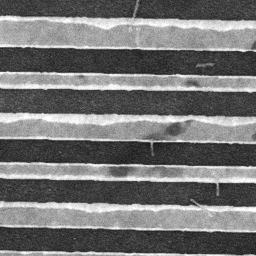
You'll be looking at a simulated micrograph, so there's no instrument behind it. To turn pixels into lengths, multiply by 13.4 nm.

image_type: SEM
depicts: lines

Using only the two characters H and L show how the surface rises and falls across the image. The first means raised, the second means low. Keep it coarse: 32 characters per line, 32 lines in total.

LLLLLLLLLLLLLLLLLLLLLLLLLLLLLLLL
LLLLLLLLLLLLLLLLLLLLLLLLLLLLLLLL
HHHHHHHHHHLLLLLLLLLLLLLLLLLLLLLL
HHHHHHHHHHHHHHHHHHHHHHHHHHHHHHHH
HHHHHHHHHHHHHHHHHHHHHHHHHHHHHHHH
HHHHHHHHHHHHHHHHHHHHHHHHHHHHHHHH
LLLLLLLLLLLLLLLLLLLLLLLLLLLLLLLL
LLLLLLLLLLLLLLLLLLLLLLLLLLLLLLLL
LLLLLLLLLLLLLLLLLLLLLLLLLLLLLLLL
HHHHHHHHHHHHHHHHHHHHHHHHHLLLLLLL
HHHHHHHHHHHHHHHHHHHHHHHHHHHHHHHH
LLLLLLLLLLLLLLLLLLLLLLLLLLLLLLLL
LLLLLLLLLLLLLLLLLLLLLLLLLLLLLLLL
LLLLLLLLLLLLLLLLLLLLLLLLLLLLLLLL
LLLLLLLLLLLLLLLLLLLLLLLLLLLLLLLL
HHHHHHHHHHHHHHHHHHHHHHHHHHHHHHHH
HHHHHHHHHHHHHHHHHHHHHHHHHHHHHHHH
LLLLLLLLLLLHHHHHHHHHHHHHHHHHHHHH
LLLLLLLLLLLLLLLLLLLLLLLLLLLLLLLL
LLLLLLLLLLLLLLLLLLLLLLLLLLLLLLLL
HHHHHHHHHHHLLLLLLLLLLLLLLLLLLLLL
HHHHHHHHHHHHHHHHHHHHHHHHHHHHHHHH
LLLLLLLLLLLLLHHHHHHHHHHHHHHHHHHH
LLLLLLLLLLLLLLLLLLLLLLLLLLLLLLLL
LLLLLLLLLLLLLLLLLLLLLLLLLLLLLLLL
HHHLLLLLLLLLLLLLLLLLLLLLLLLLLLLL
HHHHHHHHHHHHHHHHHHHHHHHHHHHHHHHH
HHHHHHHHHHHHHHHHHHHHHHHHHHHHHHHH
LLLLLLLLLLLLLHHHHHHHHHHHHHHHHHHH
LLLLLLLLLLLLLLLLLLLLLLLLLLLLLLLL
LLLLLLLLLLLLLLLLLLLLLLLLLLLLLLLL
HHLLLLLLLLLLLLLLLLLLLLLLLLLLLLLL